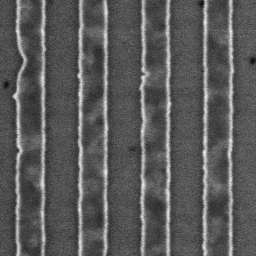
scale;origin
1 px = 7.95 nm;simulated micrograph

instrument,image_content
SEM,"parallel lines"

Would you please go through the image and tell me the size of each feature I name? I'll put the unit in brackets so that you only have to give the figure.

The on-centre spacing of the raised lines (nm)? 496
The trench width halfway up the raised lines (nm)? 284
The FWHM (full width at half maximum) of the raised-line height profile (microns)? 0.212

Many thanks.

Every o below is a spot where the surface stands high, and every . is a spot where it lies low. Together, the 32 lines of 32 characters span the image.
..oooo....ooo.....ooo.....ooo...
..ooo.....ooo.....ooo.....ooo...
..oooo....ooo.....ooo.....ooo...
..ooo.....ooo.....ooo.....ooo...
..ooo.....ooo.....ooo.....ooo...
..ooo.....ooo.....ooo.....ooo...
...ooo....ooo.....ooo.....ooo...
...oo.....ooo.....ooo.....ooo...
...ooo....ooo.....ooo.....ooo...
..ooo.....ooo.....ooo.....ooo...
..ooo.....ooo.....ooo.....ooo...
..oooo....ooo.....ooo.....ooo...
..ooo.....ooo.....ooo.....ooo...
..oooo....ooo.....ooo.....ooo...
..ooo.....ooo.....ooo.....ooo...
..oooo....ooo.....ooo.....ooo...
..oooo....ooo.....ooo.....ooo...
..oooo....ooo.....ooo.....ooo...
..oooo....ooo.....ooo.....ooo...
..ooo.....ooo.....ooo.....ooo...
..oooo....ooo.....ooo.....ooo...
..ooo.....ooo.....ooo.....ooo...
..ooo.....ooo.....ooo.....ooo...
..ooo.....ooo.....ooo.....ooo...
..ooo.....ooo.....ooo....oooo...
..ooo.....ooo.....ooo.....ooo...
..ooo.....ooo.....ooo.....ooo...
..ooo.....ooo.....ooo....oooo...
..ooo.....ooo.....ooo.....ooo...
..ooo.....ooo.....ooo.....ooo...
..ooo.....ooo.....ooo....oooo...
..ooo.....ooo.....ooo.....ooo...